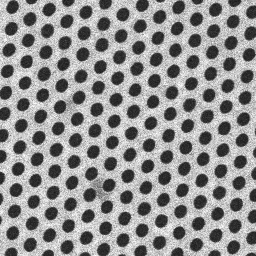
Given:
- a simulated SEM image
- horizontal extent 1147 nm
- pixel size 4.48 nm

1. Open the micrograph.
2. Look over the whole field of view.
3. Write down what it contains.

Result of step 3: a regular array of holes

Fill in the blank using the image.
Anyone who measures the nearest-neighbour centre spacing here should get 0.0941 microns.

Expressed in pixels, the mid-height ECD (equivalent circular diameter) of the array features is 13.1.